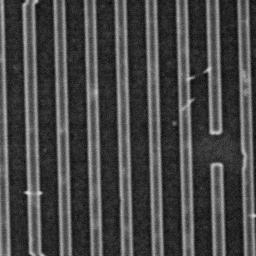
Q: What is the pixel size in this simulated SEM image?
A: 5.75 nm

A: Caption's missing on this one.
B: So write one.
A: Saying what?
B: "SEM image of parallel lines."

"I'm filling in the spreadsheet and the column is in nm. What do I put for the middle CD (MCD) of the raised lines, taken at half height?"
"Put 59.6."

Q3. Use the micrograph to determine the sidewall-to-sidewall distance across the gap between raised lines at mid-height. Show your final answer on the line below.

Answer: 114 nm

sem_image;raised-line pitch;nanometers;176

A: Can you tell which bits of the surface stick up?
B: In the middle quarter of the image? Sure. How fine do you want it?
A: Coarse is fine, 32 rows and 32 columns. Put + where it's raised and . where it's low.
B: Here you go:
+.....++.....+++.....++......++.
+.....++.....+++.....++......++.
+.....++.....+++.....++......++.
+.....++.....+++.....++......+++
+.....++......++.....++......++.
+.....++......++.....++......++.
+.....++......++.....++......++.
+.....++......++.....++......++.
+.....++......++.....++......++.
+.....++......++.....+++.....+++
+.....++......++.....+++.....++.
+.....++......++.....+++.....++.
+.....++......++.....+++.....++.
+.....++......++.....+++.....++.
+.....++......++......++.....++.
+.....++......++......++.....++.
+.....++......++......++.....++.
+.....++......++......++.....++.
+.....+++.....++......++.....++.
+.....+++.....++......++.....+++
+.....+++.....++......++.....+++
+.....+++.....++......++.....+++
+.....+++.....++......++.....+++
+.....+++.....++......++.....+++
+.....+++.....++......++.....+++
+.....+++.....++......++.....+++
+.....+++.....++......++.....+++
+.....+++.....++......++.....+++
+.....+++.....+++.....++.....+++
+.....+++.....+++.....++.....+++
+.....+++.....+++.....++.....+++
+......++.....+++.....++.....+++